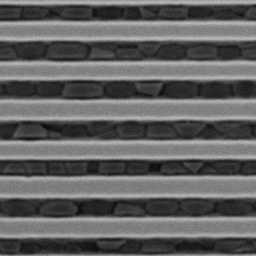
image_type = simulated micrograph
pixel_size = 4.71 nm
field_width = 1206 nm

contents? parallel lines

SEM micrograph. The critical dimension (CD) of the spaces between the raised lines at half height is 92.5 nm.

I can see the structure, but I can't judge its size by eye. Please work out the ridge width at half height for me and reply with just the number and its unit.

92.5 nm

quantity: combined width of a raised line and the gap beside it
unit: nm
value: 186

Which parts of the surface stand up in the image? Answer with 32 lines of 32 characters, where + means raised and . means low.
++..++.....+.+..++...++.++......
................................
................................
++++++++++++++++++++++++++++++++
++++++++++++++++++++++++++++++++
................................
................................
................................
++++++++++++++++++++++++++++++++
++++++++++++++++++++++++++++++++
................................
................................
...........+++++++++++++++++.+++
++++++++++++++++++++++++++++++++
++++++++++++++++++++++++++++++++
................................
................................
................................
++++++++++++++++++++++++++++++++
++++++++++++++++++++++++++++++++
................................
................................
++++++++++++++++++++++++++++++++
++++++++++++++++++++++++++++++++
++++++++++++++++++++++++++++++++
................................
................................
++++++++++++++++++++++++++++++++
++++++++++++++++++++++++++++++++
++++++++++++++++++++++++++++++++
................................
................................